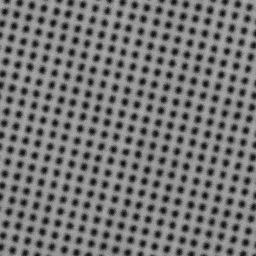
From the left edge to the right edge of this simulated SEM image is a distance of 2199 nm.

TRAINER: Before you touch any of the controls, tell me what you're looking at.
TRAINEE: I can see a regular array of holes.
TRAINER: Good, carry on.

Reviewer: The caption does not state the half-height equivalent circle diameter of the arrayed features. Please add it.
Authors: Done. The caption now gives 64.3 nanometres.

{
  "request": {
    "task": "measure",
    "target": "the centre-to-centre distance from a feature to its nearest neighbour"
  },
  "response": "0.102 microns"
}